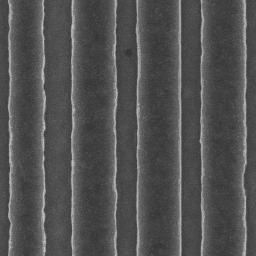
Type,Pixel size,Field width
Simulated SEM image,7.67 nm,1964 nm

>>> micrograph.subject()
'one or a few lines or trenches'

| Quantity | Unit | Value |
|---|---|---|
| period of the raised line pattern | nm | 504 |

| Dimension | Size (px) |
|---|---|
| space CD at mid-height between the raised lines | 21.6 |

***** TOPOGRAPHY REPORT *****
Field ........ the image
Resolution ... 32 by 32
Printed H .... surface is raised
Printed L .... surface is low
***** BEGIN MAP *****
LHHHHLLLLHHHHHLLLHHHHHLLLHHHHHHL
LHHHHLLLLHHHHHLLLHHHHHLLLHHHHHHL
LHHHHLLLLHHHHHLLLHHHHHLLLHHHHHHL
LHHHHLLLLHHHHHLLLHHHHHLLLHHHHHHL
LHHHHLLLLHHHHHLLLHHHHHLLLHHHHHHL
LHHHHLLLLHHHHHLLLHHHHHLLLHHHHHHL
LHHHHLLLLHHHHHLLLHHHHHLLLHHHHHHL
LHHHHLLLLHHHHHLLLHHHHHLLLHHHHHHL
LHHHHLLLLHHHHHLLLHHHHHLLLHHHHHHL
LHHHHLLLLHHHHHLLLHHHHHLLLHHHHHHL
LHHHHLLLLHHHHHLLLHHHHHLLLHHHHHHL
LHHHHHLLLHHHHHHLLHHHHHLLLHHHHHHL
LHHHHHLLLHHHHHHLLHHHHHLLLHHHHHHL
LHHHHHLLLHHHHHLLLHHHHHHLLHHHHHHL
LHHHHLLLLHHHHHLLLHHHHHLLLHHHHHHL
LHHHHHLLLHHHHHLLLHHHHHLLLHHHHHHL
LHHHHLLLLHHHHHLLLHHHHHLLLHHHHHHL
LHHHHLLLLHHHHHLLLHHHHHLLLHHHHHHL
LHHHHLLLLHHHHHLLLHHHHHLLLHHHHHHL
LHHHHLLLLHHHHHLLLHHHHHLLLHHHHHHL
LHHHHLLLLHHHHHLLLHHHHHLLLHHHHHHL
LHHHHLLLLHHHHHLLLHHHHHHLLHHHHHHL
LHHHHHLLLHHHHHLLLHHHHHHLLHHHHHLL
LHHHHHLLLHHHHHLLLHHHHHLLLHHHHHHL
LHHHHLLLLHHHHHHLLHHHHHLLLHHHHHHL
LHHHHLLLLHHHHHLLLHHHHHLLLHHHHHHL
LHHHHLLLLHHHHHLLLHHHHHLLLHHHHHHL
LHHHHLLLLHHHHHLLLHHHHHHLLHHHHHHL
LHHHHLLLLHHHHHLLLHHHHHLLLHHHHHHL
LHHHHHLLLHHHHHHLLHHHHHLLLHHHHHHL
LHHHHHLLLHHHHHLLLHHHHHHLLHHHHHHL
LHHHHHLLLHHHHHHLLHHHHHLLLHHHHHHL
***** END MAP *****